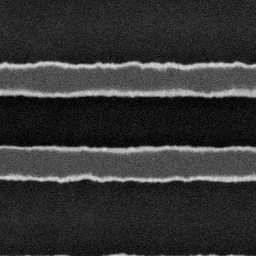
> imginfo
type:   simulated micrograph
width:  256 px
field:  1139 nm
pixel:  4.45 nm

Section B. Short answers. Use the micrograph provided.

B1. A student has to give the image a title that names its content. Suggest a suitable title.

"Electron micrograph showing lines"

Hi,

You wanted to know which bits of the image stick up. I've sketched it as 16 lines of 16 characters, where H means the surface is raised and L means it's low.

LLLLLLLLLLLLLLLL
LLLLLLLLLLLLLLLL
LLLLLLLLLLLLLLLL
LLLLLLLLLLLLLLLL
HHHHHHHHHHHHHHHH
HHHHHHHHHHHHHHHH
LLLLLLLLLLLLLLLL
LLLLLLLLLLLLLLLL
LLLLLLLLLLLLLLLL
HHHHHHHHHHHHHHHH
HHHHHHHHHHHHHHHH
LLLLLLLLLLLLLLLL
LLLLLLLLLLLLLLLL
LLLLLLLLLLLLLLLL
LLLLLLLLLLLLLLLL
LLLLLLLLLLLLLLLL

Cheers